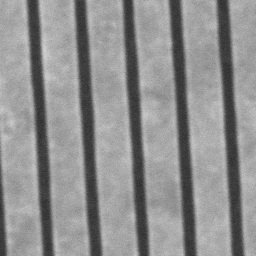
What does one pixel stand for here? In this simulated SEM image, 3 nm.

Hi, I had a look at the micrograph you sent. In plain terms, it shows parallel lines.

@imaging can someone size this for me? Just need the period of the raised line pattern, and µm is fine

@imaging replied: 0.142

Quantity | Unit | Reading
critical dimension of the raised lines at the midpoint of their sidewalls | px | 34.8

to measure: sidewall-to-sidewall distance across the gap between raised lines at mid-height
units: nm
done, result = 38.2